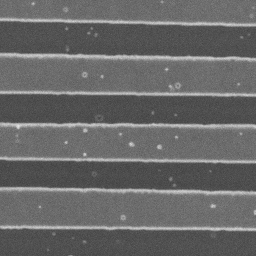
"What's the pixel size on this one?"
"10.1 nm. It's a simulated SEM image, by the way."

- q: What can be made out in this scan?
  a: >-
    lines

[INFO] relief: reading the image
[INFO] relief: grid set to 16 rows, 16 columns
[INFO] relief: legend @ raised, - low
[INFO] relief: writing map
@@@@@@@@@@@@@@@@
----------@@@@@@
----------------
@@@@@@@---------
@@@@@@@@@@@@@@@@
@@@@@@@@@@@@@@@@
----------------
----------------
@@@@@@@@@@@@@@@@
@@@@@@@@@@@@@@@@
----------------
----------------
@@@@@@@@@@@@@@@@
@@@@@@@@@@@@@@@@
----------------
----------------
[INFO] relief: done